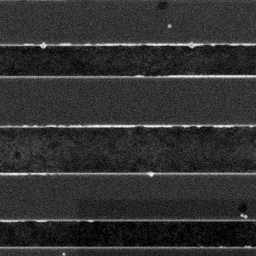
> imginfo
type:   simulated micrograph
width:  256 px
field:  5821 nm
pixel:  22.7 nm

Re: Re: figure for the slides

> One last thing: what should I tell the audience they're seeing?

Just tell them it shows lines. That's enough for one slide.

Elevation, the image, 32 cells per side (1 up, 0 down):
11111111111111111111111111111111
11111111111111111111111111111111
11111111111111111111111111111111
11111111111111111111111111111111
11111111111111111111111111111111
11111111111111111111111111100111
00000000000000000000000000000000
00000000000000000000000000000000
00000000000000000000000000000000
00000000000000000000000000000000
11111111111111111111111111111111
11111111111111111111111111111111
11111111111111111111111111111111
11111111111111111111111111111111
11111111111111111111111111111111
11111111111111111111111111111111
00000000000000000000000000000000
00000000000000000000000000000000
00000000000000000000000000000000
00000000000000000000000000000000
00000000000000000000000000000000
00000000000000000000000000000000
11111111111111111111111111111111
11111111111111111111111111111111
11111111111111111111111111111111
11111111111111111111111111111111
11111111111111111111111111111111
11111111111111111111111111111111
00000000000000000000000000000000
00000000000000000000000000000000
00000000000000000000000000000000
11111111111111111111111111111111